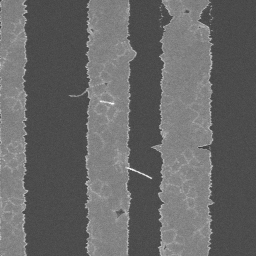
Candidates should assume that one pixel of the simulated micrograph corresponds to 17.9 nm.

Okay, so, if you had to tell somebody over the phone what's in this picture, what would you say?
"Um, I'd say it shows one or a few lines or trenches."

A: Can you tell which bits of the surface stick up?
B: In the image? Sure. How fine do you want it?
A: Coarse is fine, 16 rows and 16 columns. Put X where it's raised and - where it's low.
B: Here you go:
XX----XX--XXX---
XX----XX---XX---
XX----XX--XXX---
XX----XX--XXX---
XX---XXX--XXX---
X-----XX--XXX---
XX----XX--XXX---
XX---XXX--XXX---
XX---XXX--XXX---
XX---XXX--XXX---
XX---XXX--XXX---
XX---XXX--XXX---
XX---XXX--XXX---
X-----XX--XXX---
XX---XXX--XXX---
XX---XXX--XXX---